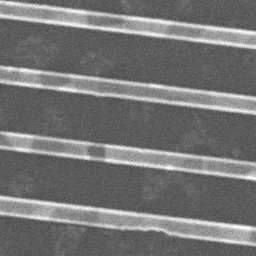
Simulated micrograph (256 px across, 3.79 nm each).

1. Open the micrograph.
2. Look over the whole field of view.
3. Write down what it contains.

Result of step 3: one or a few lines or trenches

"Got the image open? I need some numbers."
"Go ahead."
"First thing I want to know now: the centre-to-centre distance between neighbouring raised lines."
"246 nm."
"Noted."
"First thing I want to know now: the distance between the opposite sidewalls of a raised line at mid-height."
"0.0544 microns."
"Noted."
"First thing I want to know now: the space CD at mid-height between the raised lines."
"190 nm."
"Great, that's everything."